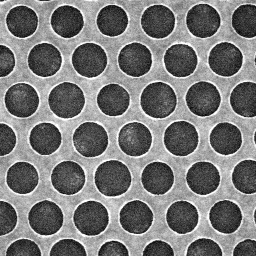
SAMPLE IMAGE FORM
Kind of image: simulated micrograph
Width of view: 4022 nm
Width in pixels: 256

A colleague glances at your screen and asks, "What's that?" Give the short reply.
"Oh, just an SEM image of a regular array of holes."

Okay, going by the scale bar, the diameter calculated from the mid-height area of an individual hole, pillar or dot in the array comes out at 551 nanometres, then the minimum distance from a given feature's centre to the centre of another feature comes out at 701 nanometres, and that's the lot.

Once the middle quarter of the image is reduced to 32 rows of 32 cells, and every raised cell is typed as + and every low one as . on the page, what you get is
++.........+++........+++.......
+++.......++++........++++......
+++......++++++.....++++++......
+++++...++++++++++++++++++++++++
.++++++++++++++++++++++.++++++++
....++++++....+++++++......+++++
....+++++.......++++........+++.
.....+++........+++.........++..
.....+++.........++.........++..
.....+++.........++.........++..
.....+++........+++.........+++.
.....++++.......+++.........+++.
....++++++.....+++++.......+++++
..++++++++++++++++++++....++++++
+++++...+++++++++..++++++++....+
++++......+++++......+++++......
+++.......++++.......++++.......
++.........++.........+++.......
++.........++.........+++.......
++.........++.........+++.......
++.........+++........+++.......
+++........+++.......+++++......
++++......+++++.....+++++++.....
++++++.+++++++++++++++++++++++++
...+++++++.....+++++++..++++++++
....+++++.......++++......++++++
.....+++........++++.......++++.
.....+++.........++........++++.
......+..........++.........++..
.....++..........++.........+++.
.....+++.........+++.......++++.
....++++........++++.......+++++